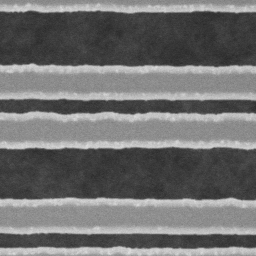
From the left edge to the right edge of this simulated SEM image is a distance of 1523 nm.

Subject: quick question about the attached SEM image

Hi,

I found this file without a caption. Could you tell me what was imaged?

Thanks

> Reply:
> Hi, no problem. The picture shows lines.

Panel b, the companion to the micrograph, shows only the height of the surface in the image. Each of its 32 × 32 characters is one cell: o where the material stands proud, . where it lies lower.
oooooooooooooooooooooooooooooooo
................................
................................
................................
................................
................................
................................
................................
ooooooooo.oo.ooo..oo...o.....ooo
oooooooooooooooooooooooooooooooo
oooooooooooooooooooooooooooooooo
oooooooooooooooooooooooooooooooo
................................
................................
oo.oooo..oo.ooo...ooooo.....oooo
oooooooooooooooooooooooooooooooo
oooooooooooooooooooooooooooooooo
oooooooooooooooooooooooooooooooo
................................
................................
................................
................................
................................
................................
................................
oooooooooooooooooooooooooooooooo
oooooooooooooooooooooooooooooooo
oooooooooooooooooooooooooooooooo
oooooooooooooooooooooooooooooooo
................................
................................
oooooooooooooooooooooooooooooooo